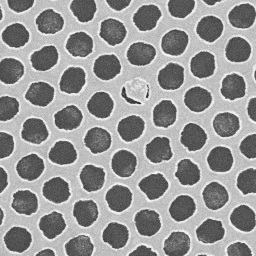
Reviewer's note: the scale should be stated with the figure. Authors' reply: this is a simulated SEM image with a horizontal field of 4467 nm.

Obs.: a regular array of holes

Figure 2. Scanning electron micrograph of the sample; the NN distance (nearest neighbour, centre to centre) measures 0.615 micrometres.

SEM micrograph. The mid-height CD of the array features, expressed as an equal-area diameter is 474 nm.